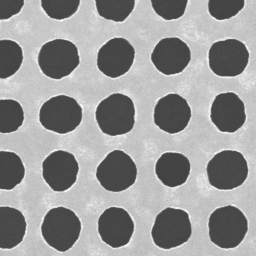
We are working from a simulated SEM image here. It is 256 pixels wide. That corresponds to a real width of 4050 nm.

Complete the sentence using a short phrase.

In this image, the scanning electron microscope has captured a regular array of holes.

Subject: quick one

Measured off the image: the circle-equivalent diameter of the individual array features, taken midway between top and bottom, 0.636 microns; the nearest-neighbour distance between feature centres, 55.2 pixels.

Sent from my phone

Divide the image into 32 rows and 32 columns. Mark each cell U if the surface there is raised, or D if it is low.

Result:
DDDUUDDDDDUUDDDDDUUDDDDUUUDDDDDU
DDUUUUDDDUUUDDDDUUUDDDDUUUDDDDUU
UUUUUUUUUUUUUUDDUUUUUUUUUUUDUUUU
UUUUUUUUUUUUUUUUUUUUUUUUUUUUUUUU
UUUUUUUUUUUUUUUUUUUUUUUUUUUUUUUU
DDUUUUDDDUUUUDDDUUUUDDDUUUUDDDUU
DDDUUDDDDDUUDDDDDUUDDDDDUUDDDDDU
DDDUUDDDDDUUDDDDDUUDDDDDUUDDDDDU
DDUUUDDDDUUUDDDDUUUUDDDUUUDDDDDU
DUUUUUDDUUUUUDDUUUUUUUUUUUUDDDUU
UUUUUUUUUUUUUUUUUUUUUUUUUUUUUUUU
UUUUUUUUUUUUUUUUUUUUUUUUUUUUUUUU
DDUUUUDDDUUUUDDDUUUUDDDUUUUDDDUU
DDDUUDDDDDUUDDDDDUUDDDDDUUDDDDDU
DDDUUDDDDDUUDDDDDUUDDDDDUUDDDDDU
DDDUUDDDDDUUDDDDDUUDDDDUUUUDDDUU
DUUUUUUDDUUUUDDDUUUUUDUUUUUUDUUU
UUUUUUUUUUUUUUUUUUUUUUUUUUUUUUUU
UUUUUUUUUUUUUUUUUUUUUUUUUUUUUUUU
DDUUUUDDDUUUUDDDUUUUDDDUUUUDDDUU
DDDUUDDDDDUUDDDDDUUUDDDDUUDDDDDU
DDDUUDDDDDUUDDDDDUUDDDDDUUDDDDDU
DDDUUUDDDDUUDDDDDUUUDDDUUUDDDDDU
DDUUUUDDDUUUUDDDUUUUUUUUUUUDDUUU
UUUUUUUUUUUUUUUUUUUUUUUUUUUUUUUU
UUUUUUUUUUUUUUUUUUUUUUUUUUUUUUUU
DDDUUUDDDUUUUDDDUUUUDDDUUUUDDDUU
DDDUUDDDDDUUDDDDDUUDDDDDUUDDDDDU
DDDUUDDDDDUUDDDDDUUDDDDDUUDDDDDU
DDDUUDDDDDUUDDDDUUUDDDDDUUDDDDDU
DDUUUUDDDUUUUDDDUUUDDDDUUUUDDDUU
UUUUUUUUUUUUUUUUUUUUUUUUUUUUUUUU